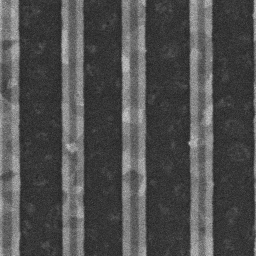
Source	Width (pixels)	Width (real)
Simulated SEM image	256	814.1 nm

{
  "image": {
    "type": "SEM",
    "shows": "one or a few lines or trenches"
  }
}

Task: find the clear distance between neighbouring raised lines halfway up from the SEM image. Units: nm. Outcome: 156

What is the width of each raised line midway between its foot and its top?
50 nm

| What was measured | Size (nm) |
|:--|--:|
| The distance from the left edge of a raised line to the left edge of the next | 204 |